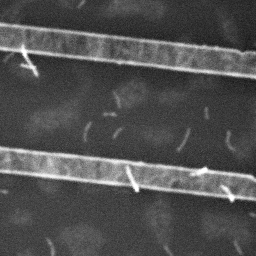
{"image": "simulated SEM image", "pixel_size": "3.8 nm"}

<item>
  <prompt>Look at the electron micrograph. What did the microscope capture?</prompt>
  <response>one or a few lines or trenches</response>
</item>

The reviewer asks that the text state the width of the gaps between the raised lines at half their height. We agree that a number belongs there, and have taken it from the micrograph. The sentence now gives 0.376 um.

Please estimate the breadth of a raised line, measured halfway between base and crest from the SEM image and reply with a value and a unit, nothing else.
91.7 nm